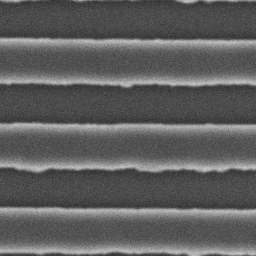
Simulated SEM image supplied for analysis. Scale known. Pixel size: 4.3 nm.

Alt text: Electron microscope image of lines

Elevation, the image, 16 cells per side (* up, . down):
................
................
*********.......
****************
****************
................
................
................
****************
****************
.***************
................
................
****************
****************
****************